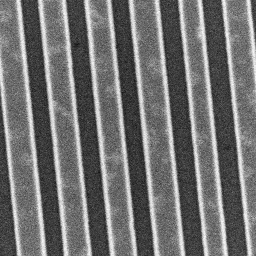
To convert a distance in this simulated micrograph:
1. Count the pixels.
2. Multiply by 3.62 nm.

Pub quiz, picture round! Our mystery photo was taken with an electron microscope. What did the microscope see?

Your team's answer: parallel lines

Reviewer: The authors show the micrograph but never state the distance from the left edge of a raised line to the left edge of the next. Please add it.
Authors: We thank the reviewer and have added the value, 166 nanometres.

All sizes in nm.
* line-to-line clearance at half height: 75.2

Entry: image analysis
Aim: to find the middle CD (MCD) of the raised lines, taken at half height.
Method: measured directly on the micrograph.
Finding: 88.7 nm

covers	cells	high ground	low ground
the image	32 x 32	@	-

@@---@@@---@@@--@@@@---@@---@@@-
@@@--@@@---@@@--@@@@---@@---@@@-
@@@--@@@---@@@---@@@---@@---@@@-
@@@--@@@---@@@---@@@---@@---@@@@
@@@--@@@---@@@---@@@---@@---@@@@
@@@---@@@--@@@---@@@---@@@--@@@@
@@@---@@@--@@@---@@@---@@@---@@@
@@@---@@@--@@@---@@@---@@@---@@@
@@@---@@@---@@@--@@@@--@@@---@@@
@@@---@@@---@@@--@@@@--@@@---@@@
@@@---@@@---@@@--@@@@---@@---@@@
@@@@--@@@---@@@--@@@@---@@---@@@
@@@@--@@@---@@@---@@@---@@---@@@
@@@@--@@@---@@@---@@@---@@---@@@
-@@@--@@@---@@@---@@@---@@@--@@@
-@@@---@@@--@@@---@@@---@@@--@@@
-@@@---@@@--@@@---@@@---@@@---@@
-@@@---@@@---@@---@@@---@@@---@@
-@@@---@@@---@@@--@@@@--@@@---@@
-@@@---@@@---@@@--@@@@--@@@---@@
-@@@---@@@---@@@--@@@@---@@---@@
-@@@@--@@@---@@@--@@@@---@@---@@
-@@@@--@@@---@@@---@@@---@@---@@
-@@@@--@@@---@@@---@@@---@@---@@
--@@@--@@@@--@@@---@@@---@@@--@@
--@@@---@@@--@@@---@@@---@@@---@
--@@@---@@@--@@@---@@@---@@@---@
--@@@---@@@--@@@---@@@@--@@@---@
--@@@---@@@---@@@--@@@@--@@@---@
--@@@---@@@---@@@--@@@@--@@@---@
--@@@---@@@---@@@--@@@@---@@---@
--@@@@--@@@---@@@--@@@@---@@---@